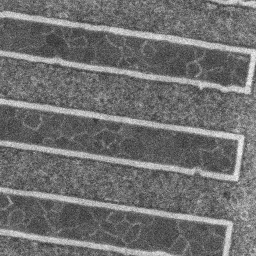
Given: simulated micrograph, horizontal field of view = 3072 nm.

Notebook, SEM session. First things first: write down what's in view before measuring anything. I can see one or a few lines or trenches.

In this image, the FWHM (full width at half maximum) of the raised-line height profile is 0.495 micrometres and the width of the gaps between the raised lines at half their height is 45.6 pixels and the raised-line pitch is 1050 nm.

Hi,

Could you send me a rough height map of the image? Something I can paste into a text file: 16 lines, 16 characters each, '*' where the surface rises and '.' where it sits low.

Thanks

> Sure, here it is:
................
*****...........
***********.....
.***************
........********
..............*.
*...............
********........
**************..
....***********.
..........*****.
................
*****...........
***********.....
**************..
.......*******..